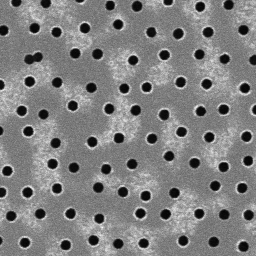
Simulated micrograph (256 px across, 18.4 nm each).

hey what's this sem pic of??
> a regular array of holes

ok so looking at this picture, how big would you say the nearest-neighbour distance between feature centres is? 454 nanometers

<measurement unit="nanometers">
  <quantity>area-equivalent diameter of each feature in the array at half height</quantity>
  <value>200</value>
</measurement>